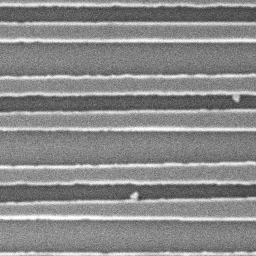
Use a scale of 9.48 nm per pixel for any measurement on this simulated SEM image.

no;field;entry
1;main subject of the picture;lines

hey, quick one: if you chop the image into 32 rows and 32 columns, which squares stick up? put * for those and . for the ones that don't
********************************
................................
................................
********************************
********************************
................................
................................
................................
................................
......................**.*.*****
********************************
********************************
................................
................................
********************************
********************************
................................
................................
................................
................................
...........................*****
********************************
********************************
................................
................................
********************************
********************************
................................
................................
................................
................................
................................